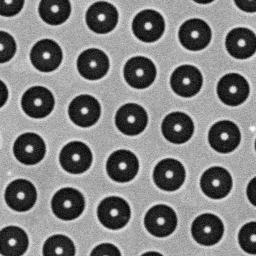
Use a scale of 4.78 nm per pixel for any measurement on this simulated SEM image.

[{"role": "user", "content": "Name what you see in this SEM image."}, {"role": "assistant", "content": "an array of small figures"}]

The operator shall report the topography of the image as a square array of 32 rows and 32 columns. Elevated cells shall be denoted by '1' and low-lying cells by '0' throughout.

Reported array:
00011000011000111111111110111000
00111000011000011000111111111110
11111000111000011000011001111111
11111111111000110000010000111001
01111111111111111000110000110000
00110001111111111111111000110000
00110000110001111111111111110000
01110000110000110001111111111111
11110001110000100000110001111111
11111111110001100000100001110011
01111111111111110001100001100001
01100011111111111111110001100001
01100001100011111111111111100001
11100001000001100011111111111111
11100011000001000011100011111111
11111111100011000011000011100111
11101111111111100011000011000011
11000111111111111111100011000011
11000011000111111111111111000011
11000010000011000111111111111111
11100110000010000110000111111111
11111111000110000110000110000111
11011111111111000110000110000110
10001111011111111111000110000110
10000110000110011111111111001110
10001100000100001111011111111110
11011110001100001100001111111111
11111111011100001100001100001111
00011111111110011100001100001100
00011100111111111110011100001100
00001000011100111111111110011100
00011000011000011100111111111110